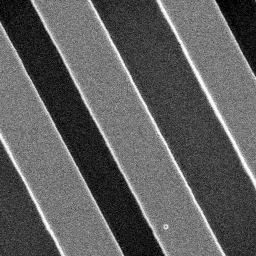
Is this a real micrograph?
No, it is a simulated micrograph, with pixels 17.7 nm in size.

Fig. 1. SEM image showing lines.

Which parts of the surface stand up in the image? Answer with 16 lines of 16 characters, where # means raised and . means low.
..####....####..
...###.....###..
#..####....####.
#...###.....###.
##..####....####
##...###.....###
###..####....###
###...####....##
####..####....##
.###...####....#
.####...###....#
..###...####....
..####...###....
...###...####...
...####...###...
....###...####..